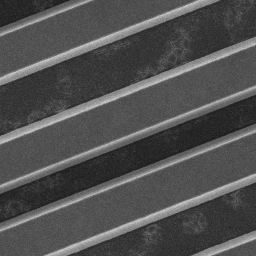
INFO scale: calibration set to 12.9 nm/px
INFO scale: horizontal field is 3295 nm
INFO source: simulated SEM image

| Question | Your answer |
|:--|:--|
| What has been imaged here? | one or a few lines or trenches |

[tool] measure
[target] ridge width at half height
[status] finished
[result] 0.594 µm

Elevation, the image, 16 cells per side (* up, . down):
....********....
.********.......
*******.........
****..........**
**.........*****
........********
......********..
...********.....
.********......*
******......****
***.......******
*......********.
....********....
..********......
*******.........
*****.........**